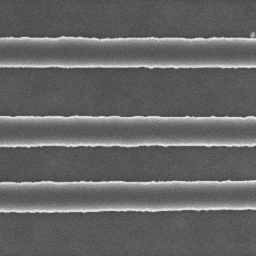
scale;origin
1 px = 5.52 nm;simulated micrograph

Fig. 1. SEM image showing lines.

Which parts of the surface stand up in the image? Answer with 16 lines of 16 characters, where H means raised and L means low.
LLLLLLLLLLLLLLLL
LLLLLLLLLLLLLLLL
HHHHHHHHHHHHHHHH
HHHHHHHHHHHHHHHH
LLLLLLLLLLLLLLLL
LLLLLLLLLLLLLLLL
LLLLLLLLLLLLLLLL
HHHHHHHHHHHHHHHH
HHHHHHHHHHHHHHHH
LLLLLLLLLLLLLLLL
LLLLLLLLLLLLLLLL
HHHHHHHHHHHHHHHH
HHHHHHHHHHHHHHHH
LLLLLLLLLLLLLLLL
LLLLLLLLLLLLLLLL
LLLLLLLLLLLLLLLL